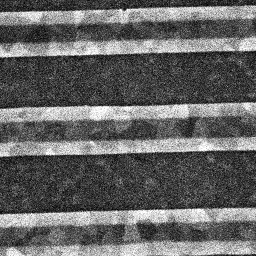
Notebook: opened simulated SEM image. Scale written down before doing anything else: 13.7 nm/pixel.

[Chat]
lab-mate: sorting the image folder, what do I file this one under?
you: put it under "one or a few lines or trenches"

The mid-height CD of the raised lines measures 481 nanometres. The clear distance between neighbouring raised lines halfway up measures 0.902 micrometres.